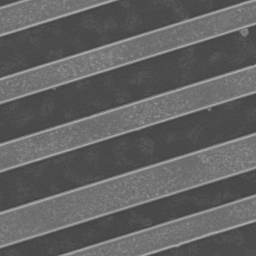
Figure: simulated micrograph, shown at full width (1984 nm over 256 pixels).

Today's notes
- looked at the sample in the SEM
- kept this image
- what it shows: one or a few lines or trenches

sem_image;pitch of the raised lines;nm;501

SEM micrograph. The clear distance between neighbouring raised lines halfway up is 318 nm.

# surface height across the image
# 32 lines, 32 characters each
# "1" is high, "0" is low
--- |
00111111111110000000000000000011
11111111100000000000000000011111
11111100000000000000000011111111
11100000000000000000011111111100
00000000000000000111111111100000
00000000000000111111111100000000
00000000000111111111000000000000
00000000111111111000000000000000
00001111111111000000000000000001
01111111111000000000000000001111
11111111000000000000000001111111
11110000000000000000001111111111
10000000000000000011111111111000
00000000000000011111111110000000
00000000000011111111110000000000
00000000011111111110000000000000
00000011111111110000000000000000
00111111111110000000000000000011
11111111100000000000000000111111
11111100000000000000000111111111
11100000000000000000111111111111
00000000000000000111111111111100
00000000000000111111111111100000
00000000000111111111111100000000
00000001111111111111000000000000
00001111111111111000000000000111
01111111111111000000000001111111
11111111111000000000001111111111
11111111000000000001111111111000
11110000000000001111111111000000
10000000000001111111111000000000
00000000011111111110000000000000